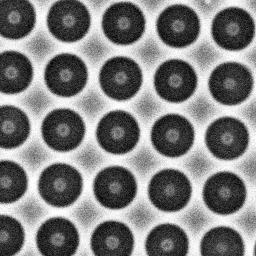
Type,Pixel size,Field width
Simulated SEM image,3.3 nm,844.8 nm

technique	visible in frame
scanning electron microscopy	an array of small figures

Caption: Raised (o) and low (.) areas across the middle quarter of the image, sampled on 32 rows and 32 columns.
......ooo..........ooooo........
......ooo..........oooo.........
oo....ooo....oo.....ooo.........
o.....ooo....oo.....oo.....oo...
......ooo....oo.....oo.....oo...
.....oooo..........ooo..........
.....oooo..........oooo.........
....oooooo........ooooo.........
ooooooooooo......ooooooo.......o
ooooooooooooo..ooooooooooo....oo
oooooooooooooooooooooooooooooooo
..oooooooooo....oooooooooooooooo
....oooooo.......oooooooo....ooo
.....oooo.........oooooo.......o
.....ooo..........ooooo.........
.....ooo...........ooo..........
o.....oo....ooo....ooo..........
o.....oo....ooo....oo.....oo....
.....ooo...........ooo....oo....
.....ooo..........oooo..........
....ooooo.........oooo..........
..oooooooo.......oooooo........o
ooooooooooo....ooooooooo......oo
oooooooooooooooooooooooooo..oooo
oooooooooooooooooooooooooooooooo
..ooooooooo...oooooooooooooooooo
....ooooo.......oooooooo....oooo
.....ooo.........oooooo.......oo
.....oo...........oooo.........o
.....oo...........ooo...........
.....oo.....oo....ooo...........
.....oo.....oo....ooo.....o.....